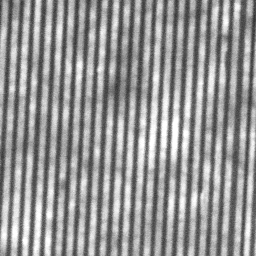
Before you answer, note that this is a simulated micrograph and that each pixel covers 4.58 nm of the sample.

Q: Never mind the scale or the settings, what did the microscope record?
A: parallel lines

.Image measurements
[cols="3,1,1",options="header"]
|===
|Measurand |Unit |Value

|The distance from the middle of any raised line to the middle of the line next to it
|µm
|0.0507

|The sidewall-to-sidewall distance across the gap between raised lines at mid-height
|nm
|26.9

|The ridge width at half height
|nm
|22.9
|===